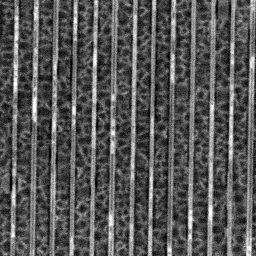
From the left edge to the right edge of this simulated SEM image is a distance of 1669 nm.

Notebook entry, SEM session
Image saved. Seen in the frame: parallel lines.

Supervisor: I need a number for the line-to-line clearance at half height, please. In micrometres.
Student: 0.103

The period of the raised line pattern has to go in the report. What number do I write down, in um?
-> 0.129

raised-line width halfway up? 3.5 px